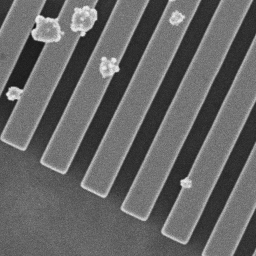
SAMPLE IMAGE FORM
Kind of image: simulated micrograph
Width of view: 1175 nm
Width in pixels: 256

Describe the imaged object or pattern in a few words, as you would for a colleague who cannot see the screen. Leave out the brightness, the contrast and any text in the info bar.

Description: groups of lines, slits or small figures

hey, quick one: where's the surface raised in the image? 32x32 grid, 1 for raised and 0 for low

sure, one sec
00111100111100111100011110011110
01111000111100111100111100011110
01111111111101111100111100111100
11111111111001111000111000111100
11111111110001111001111001111000
11100111110011110011110001111001
11100111100011110011110001110001
11000111100111100011110011110011
11001111000111100111100011100011
10001111001111000111000111100111
10011110001111001111000111100111
01111110011110001111001111000111
00111100011110011110001111001111
00111100111100011110011110001111
01111000111100111100011110011110
01111001111000111100111100011110
11110001111001111000111100111100
11110011110001111001111000111100
00100011110011110001111001111000
00000111100011110011110001111001
00000111100111100011110011110001
00000001000111100111100011110011
00000000001111000111100111100011
00000000000111001111000111100111
00000000000000001111001111000111
00000000000000011110001111001111
00000000000000001110011110001111
00000000000000000000011110011110
00000000000000000000111100011110
00000000000000000000011100111100
00000000000000000000000000111100
00000000000000000000000001111000